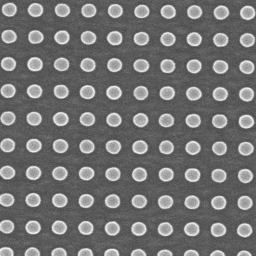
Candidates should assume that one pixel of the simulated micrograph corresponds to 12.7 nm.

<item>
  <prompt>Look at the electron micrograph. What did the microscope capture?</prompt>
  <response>a regular array of raised bodies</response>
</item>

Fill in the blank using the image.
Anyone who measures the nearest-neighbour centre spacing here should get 336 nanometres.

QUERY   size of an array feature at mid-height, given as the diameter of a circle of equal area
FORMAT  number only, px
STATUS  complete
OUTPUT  13.5